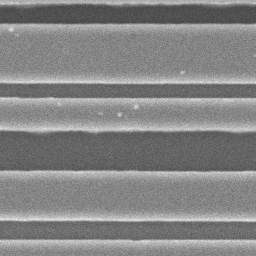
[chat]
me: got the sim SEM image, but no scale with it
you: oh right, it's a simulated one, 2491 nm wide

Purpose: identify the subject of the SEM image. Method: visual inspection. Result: lines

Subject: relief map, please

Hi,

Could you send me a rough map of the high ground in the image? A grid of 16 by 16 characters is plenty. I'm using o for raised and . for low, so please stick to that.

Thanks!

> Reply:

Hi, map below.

................
ooo.............
oooooooooooooooo
oooooooooooooooo
oooooooooooooooo
oooooooooooooooo
oooooooooooooooo
oooooooooooooooo
................
................
................
oooooooooooooooo
oooooooooooooooo
oooooooooooooooo
oooooooooooooooo
oooooooooooooooo